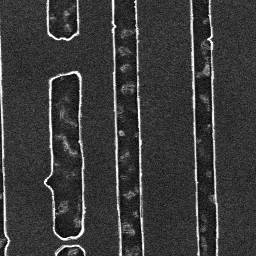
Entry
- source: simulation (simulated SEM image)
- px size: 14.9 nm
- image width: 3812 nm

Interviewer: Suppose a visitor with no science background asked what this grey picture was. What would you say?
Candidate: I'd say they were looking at one or a few lines or trenches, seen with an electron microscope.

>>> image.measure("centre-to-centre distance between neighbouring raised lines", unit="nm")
1040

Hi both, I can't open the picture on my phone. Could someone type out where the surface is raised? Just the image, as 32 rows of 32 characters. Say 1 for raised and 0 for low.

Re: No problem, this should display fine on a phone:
11111100001111000111111100111111
11111100001111000111111100111111
11111100001111000111111100111111
11111100001111000111111100111111
11111110011111000111111100111111
11111111111111000111111100111111
11111111111111000111111100111111
11111111111111000111111100111111
11111111111111000111111100111111
11111111001111000111111100011111
11111100001111000111111100011111
11111100001111000111111100011111
11111100001111000111111100011111
11111100001111000111111100011111
11111100001111000111111100011111
11111100001111000111111100011111
11111100001111100111111100011111
11111100001111100111111100011111
11111100001111100011111100011111
11111100001111100011111100011111
11111100001111100011111110011111
11111100001111100011111110011111
01111100001111100011111110011111
01111100001111100011111110011111
11111110001111100011111110011111
11111110001111100011111110011111
01111110001111100011111110011111
01111110001111100011111110011111
01111110001111100011111110011111
01111110001111100011111110011111
01111111111111100011111110011111
01111110001111100011111110011111